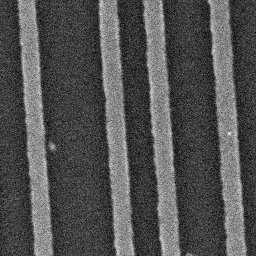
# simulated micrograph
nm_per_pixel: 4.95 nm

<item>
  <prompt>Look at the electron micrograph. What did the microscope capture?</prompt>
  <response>lines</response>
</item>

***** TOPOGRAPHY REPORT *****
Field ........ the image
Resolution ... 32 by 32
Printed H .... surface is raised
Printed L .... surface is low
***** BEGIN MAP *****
LLHHLLLLLLLLHHHLLLHHLLLLLLHHHLLL
LLHHLLLLLLLLLHHLLLHHLLLLLLHHHLLL
LLLHLLLLLLLLLHHLLLHHLLLLLLHHHLLL
LLLHHLLLLLLLLHHLLLHHLLLLLLHHHLLL
LLLHHLLLLLLLLHHLLLHHLLLLLLLHHLLL
LLLHHLLLLLLLLHHLLLHHLLLLLLLHHLLL
LLLHHLLLLLLLLHHLLLHHHLLLLLLHHLLL
LLLHHLLLLLLLLHHLLLHHHLLLLLLHHLLL
LLLHHLLLLLLLLHHLLLLHHLLLLLLHHLLL
LLLHHLLLLLLLLHHLLLLHHLLLLLLHHLLL
LLLHHLLLLLLLLHHLLLLHHLLLLLLHHLLL
LLLHHLLLLLLLLHHLLLLHHLLLLLLHHLLL
LLLHHLLLLLLLLHHLLLLHHLLLLLLHHLLL
LLLHHLLLLLLLLHHLLLLHHLLLLLLHHLLL
LLLHHLLLLLLLLHHLLLLHHLLLLLLHHLLL
LLLHHLLLLLLLLHHLLLLHHLLLLLLHHHLL
LLLHHHLLLLLLLHHHLLLHHLLLLLLHHHLL
LLLHHHLLLLLLLLHHLLLHHLLLLLLLHHLL
LLLHHHLLLLLLLLHHLLLHHHLLLLLLHHLL
LLLLHHLLLLLLLLHHLLLHHHLLLLLLHHLL
LLLLHHLLLLLLLLHHLLLHHHLLLLLLHHLL
LLLLHHLLLLLLLLHHLLLLHHLLLLLLHHLL
LLLLHHLLLLLLLLHHLLLLHHLLLLLLHHLL
LLLLHHLLLLLLLLHHLLLLHHLLLLLLHHLL
LLLLHHLLLLLLLLHHLLLLHHLLLLLLHHLL
LLLLHHLLLLLLLLHHLLLLHHLLLLLLHHLL
LLLLHHLLLLLLLLHHLLLLHHLLLLLLHHLL
LLLLHHLLLLLLLLHHLLLLHHLLLLLLHHLL
LLLLHHLLLLLLLLHHLLLLHHLLLLLLHHLL
LLLLHHLLLLLLLLHHHLLLHHLLLLLLHHLL
LLLLHHLLLLLLLLHHHLLLHHLLLLLLHHHL
LLLLHHHLLLLLLLLHHLLLHHLLLLLLHHHL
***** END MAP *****